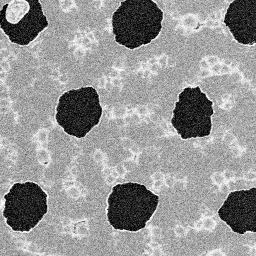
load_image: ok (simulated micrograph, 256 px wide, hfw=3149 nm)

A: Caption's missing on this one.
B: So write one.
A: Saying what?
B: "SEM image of holes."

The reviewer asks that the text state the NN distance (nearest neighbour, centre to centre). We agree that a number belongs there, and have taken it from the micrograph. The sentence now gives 1320 nm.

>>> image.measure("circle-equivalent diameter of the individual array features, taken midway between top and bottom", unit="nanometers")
588